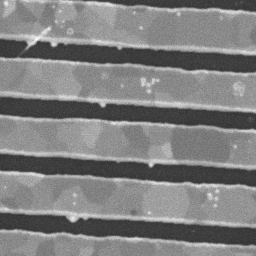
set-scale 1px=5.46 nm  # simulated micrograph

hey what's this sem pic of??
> lines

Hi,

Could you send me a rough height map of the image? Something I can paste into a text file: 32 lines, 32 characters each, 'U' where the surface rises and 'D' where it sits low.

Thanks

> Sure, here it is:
UUUUUUUUUUUUUUDDDDDDDDDDDDDDDDDD
UUUUUUUUUUUUUUUUUUUUUUUUUUUUUUUU
UUUUUUUUUUUUUUUUUUUUUUUUUUUUUUUU
UUUUUUUUUUUUUUUUUUUUUUUUUUUUUUUU
UUUUUUUUUUUUUUUUUUUUUUUUUUUUUUUU
DDDDDDDDDDDDUUUUUUUUUUUUUUUUUUUU
DDDDDDDDDDDDDDDDDDDDDDDDDDDDDUUU
UUUUUUDDDDDDDDDDDDDDDDDDDDDDDDDD
UUUUUUUUUUUUUUUUUUUUUUDDDDDDDDDD
UUUUUUUUUUUUUUUUUUUUUUUUUUUUUUUU
UUUUUUUUUUUUUUUUUUUUUUUUUUUUUUUU
UUUUUUUUUUUUUUUUUUUUUUUUUUUUUUUU
DDDDDDDDDDUUUUUUUUUUUUUUUUUUUUUU
DDDDDDDDDDDDDDDDDDDDDDDDDUUUUUUU
UUDDDDDDDDDDDDDDDDDDDDDDDDDDDDDD
UUUUUUUUUUUUUUUUUUUUUDDDDDDDDDDD
UUUUUUUUUUUUUUUUUUUUUUUUUUUUUUUU
UUUUUUUUUUUUUUUUUUUUUUUUUUUUUUUU
UUUUUUUUUUUUUUUUUUUUUUUUUUUUUUUU
DDDDDDDDUUUUUUUUUUUUUUUUUUUUUUUU
DDDDDDDDDDDDDDDDDDDDDDDDUUUUUUUU
UUUDDDDDDDDDDDDDDDDDDDDDDDDDDDDD
UUUUUUUUUUUUUUUUUDDDDDDDDDDDDDDD
UUUUUUUUUUUUUUUUUUUUUUUUUUUUUUUU
UUUUUUUUUUUUUUUUUUUUUUUUUUUUUUUU
UUUUUUUUUUUUUUUUUUUUUUUUUUUUUUUU
DUUUUUUUUUUUUUUUUUUUUUUUUUUUUUUU
DDDDDDDDDDDDDDDDDDUUUUUUUUUUUUUU
DDDDDDDDDDDDDDDDDDDDDDDDDDDDDDDD
UUUUUUUUUUUDDDDDDDDDDDDDDDDDDDDD
UUUUUUUUUUUUUUUUUUUUUUUUUUDDDDDD
UUUUUUUUUUUUUUUUUUUUUUUUUUUUUUUU